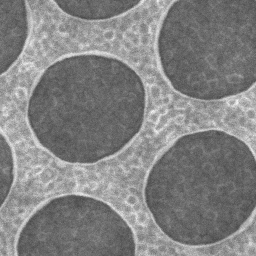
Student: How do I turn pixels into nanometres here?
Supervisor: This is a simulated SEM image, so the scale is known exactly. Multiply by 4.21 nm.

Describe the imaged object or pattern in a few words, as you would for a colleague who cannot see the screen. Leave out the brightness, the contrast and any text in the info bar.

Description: holes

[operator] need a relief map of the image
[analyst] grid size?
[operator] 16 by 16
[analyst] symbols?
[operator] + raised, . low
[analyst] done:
..++....+++.....
..++++++++......
..++++++++......
.++++..+++......
+++.....++......
++.......++.....
++.......+++++++
++.......+++++++
++......+++....+
.++....+++......
.++++++++.......
.++++++++.......
+++...+++.......
++.....+++......
+.......++.....+
+.......++++++++